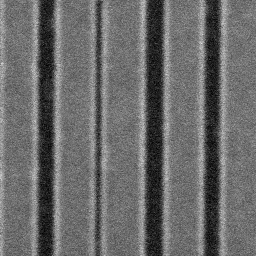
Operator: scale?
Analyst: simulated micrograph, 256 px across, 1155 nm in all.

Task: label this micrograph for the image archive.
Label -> parallel lines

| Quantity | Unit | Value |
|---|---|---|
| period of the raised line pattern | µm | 0.246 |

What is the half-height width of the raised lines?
0.168 microns